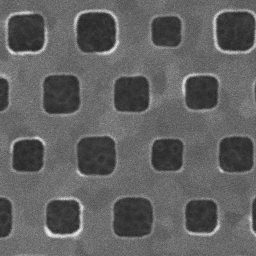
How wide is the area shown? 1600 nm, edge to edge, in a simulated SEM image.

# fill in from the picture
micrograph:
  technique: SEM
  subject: a regular array of holes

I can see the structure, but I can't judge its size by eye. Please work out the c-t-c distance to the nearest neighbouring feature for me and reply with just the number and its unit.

436 nanometres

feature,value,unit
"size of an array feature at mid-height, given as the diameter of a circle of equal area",226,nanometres